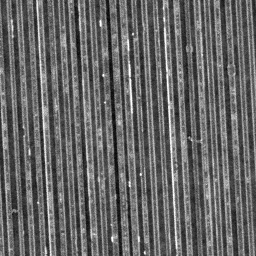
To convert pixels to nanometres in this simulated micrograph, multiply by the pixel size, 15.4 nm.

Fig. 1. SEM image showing parallel lines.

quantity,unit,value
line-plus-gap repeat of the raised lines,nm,161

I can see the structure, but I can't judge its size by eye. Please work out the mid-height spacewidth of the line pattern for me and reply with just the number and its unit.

88.4 nanometers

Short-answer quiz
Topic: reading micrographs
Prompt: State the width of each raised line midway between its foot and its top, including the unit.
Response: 75 nanometres